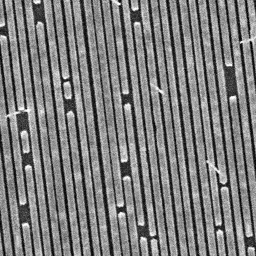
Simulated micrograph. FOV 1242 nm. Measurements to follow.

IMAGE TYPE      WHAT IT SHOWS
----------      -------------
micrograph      parallel lines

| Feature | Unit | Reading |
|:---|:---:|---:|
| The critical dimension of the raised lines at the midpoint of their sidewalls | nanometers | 31.9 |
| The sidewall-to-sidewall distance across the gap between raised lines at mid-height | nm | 13.8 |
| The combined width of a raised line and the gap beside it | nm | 46.6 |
